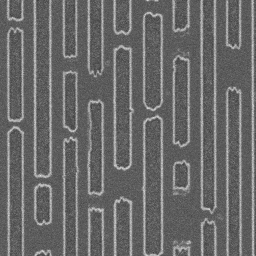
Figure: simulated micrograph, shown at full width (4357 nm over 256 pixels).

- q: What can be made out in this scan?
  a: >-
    parallel lines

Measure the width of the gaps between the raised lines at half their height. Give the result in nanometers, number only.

242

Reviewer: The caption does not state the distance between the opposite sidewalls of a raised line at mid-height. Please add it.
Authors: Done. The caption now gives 215 nm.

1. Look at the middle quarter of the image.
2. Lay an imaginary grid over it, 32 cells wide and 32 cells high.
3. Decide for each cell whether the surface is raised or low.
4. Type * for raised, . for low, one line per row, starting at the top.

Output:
******....***....***.....**....*
******...****....***.....**....*
...****.*****....***.....**....*
...**********....***.....**....*
...**********....***.....**....*
...**********....***.....**....*
...**********....***.....**....*
...**********....***.....**....*
...**********....***.....**....*
...**********....***....***....*
...***....***....****...***....*
...***....***....**********....*
...***....***....**********....*
...***....***....*****..***....*
...***....***....***.....**....*
...***....***....***.....**....*
*..***....***....***.....**....*
******....***....***.....**....*
******....***....***.....**....*
...***....***....***.....***...*
...***....***....***.....*******
...***....***....***.....*******
...***....***....***.....*******
...***....***....***.....*******
...***....***....***.....****.**
...***....***...****.....***...*
....**....**********.....**....*
...***....**********.....**....*
...***....**********.....**....*
...***....**********.....**....*
...***....**********.....**....*
...***....**********.....*******